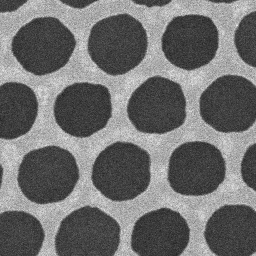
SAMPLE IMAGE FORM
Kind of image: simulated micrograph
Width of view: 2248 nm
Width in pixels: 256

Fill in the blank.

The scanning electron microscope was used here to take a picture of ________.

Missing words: a regular array of holes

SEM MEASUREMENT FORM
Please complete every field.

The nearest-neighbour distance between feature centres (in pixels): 73.4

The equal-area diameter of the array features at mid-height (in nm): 522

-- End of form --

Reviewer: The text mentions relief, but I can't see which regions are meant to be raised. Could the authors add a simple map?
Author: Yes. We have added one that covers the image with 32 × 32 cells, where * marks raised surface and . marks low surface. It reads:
...*****...******....***********
.******************************.
****...******....****.....****..
***.....****......***......***..
**.......**.......**.......**...
*.........*.......**.......**...
*........**.......**.......***..
**.......***......***.....****..
***.....****.....******..*******
*******************.********..**
...******...******....****......
....****......***......**.......
.....**.......**.......**.......
.....**.......**.......**.......
.....**.......**.......**.......
....***......****......***......
...*****....*****....*******..**
********************************
*****...*****.....****.....****.
***......***.......**.......**..
**........**.......**.......**..
**........*........**.......**..
**........*........**.......**..
**.......***......***......****.
***......****....*******.*******
*****.**************************
...******....******...*****.....
.....***......***......***......
.....**........**.......**......
......*........*........*.......
.....**........*........**......
.....**........**......***......